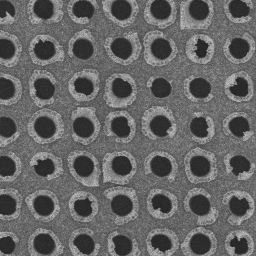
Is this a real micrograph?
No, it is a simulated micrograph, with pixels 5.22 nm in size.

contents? a regular array of holes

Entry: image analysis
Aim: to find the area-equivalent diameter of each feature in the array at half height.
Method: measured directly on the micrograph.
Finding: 105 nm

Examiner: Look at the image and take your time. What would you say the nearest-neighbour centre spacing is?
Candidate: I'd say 200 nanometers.